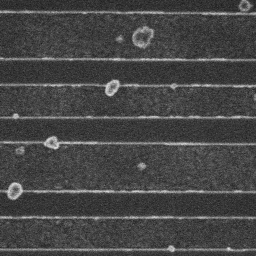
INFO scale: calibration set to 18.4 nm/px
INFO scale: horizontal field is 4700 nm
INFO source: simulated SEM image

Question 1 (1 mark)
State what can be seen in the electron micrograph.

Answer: lines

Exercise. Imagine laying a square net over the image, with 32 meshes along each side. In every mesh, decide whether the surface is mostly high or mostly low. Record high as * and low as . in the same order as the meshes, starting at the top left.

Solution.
********************************
********************************
................................
................................
.................*..............
.................*..............
................................
****************.************...
********************************
********************************
********************************
.............*..................
................................
................................
................................
********************************
********************************
********************************
................................
................................
................................
................................
................................
.**.............................
********************************
********************************
********************************
................................
................................
................................
................................
********************************